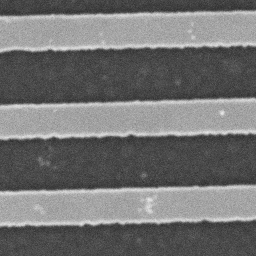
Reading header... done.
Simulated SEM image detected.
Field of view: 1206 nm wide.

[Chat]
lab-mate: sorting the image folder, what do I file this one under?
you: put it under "lines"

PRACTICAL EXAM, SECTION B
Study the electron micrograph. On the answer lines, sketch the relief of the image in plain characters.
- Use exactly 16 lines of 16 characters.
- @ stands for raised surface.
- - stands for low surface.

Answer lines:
----------------
@@@@@@@@@@@@@@@@
@@@@@@@@@@@@@@@@
----------------
----------------
----------------
---@@@@@@@@@@@@@
@@@@@@@@@@@@@@@@
@@@@@@@@--------
----------------
----------------
----------------
@@@@@@@@@@@@@@@@
@@@@@@@@@@@@@@@@
----------------
----------------